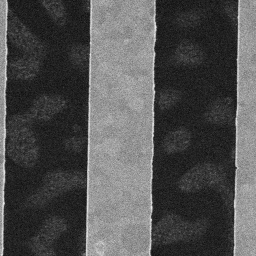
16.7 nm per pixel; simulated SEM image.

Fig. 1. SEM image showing one or a few lines or trenches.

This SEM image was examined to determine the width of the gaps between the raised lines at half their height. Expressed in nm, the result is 1410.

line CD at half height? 1060 nanometers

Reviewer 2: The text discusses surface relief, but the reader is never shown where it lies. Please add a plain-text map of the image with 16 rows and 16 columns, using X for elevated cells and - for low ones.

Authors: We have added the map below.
------XXXX-----X
------XXXX-----X
------XXXX-----X
------XXXX-----X
------XXXX-----X
------XXXX-----X
------XXXX-----X
------XXXX-----X
------XXXX-----X
------XXXX-----X
------XXX------X
------XXX------X
-----XXXX------X
-----XXXX------X
-----XXXX------X
-----XXXX------X